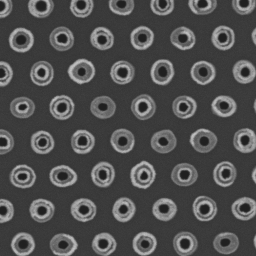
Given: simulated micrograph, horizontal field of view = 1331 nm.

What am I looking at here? a regular array of ring-shaped raised bodies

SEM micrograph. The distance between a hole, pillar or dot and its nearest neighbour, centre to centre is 39.1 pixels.